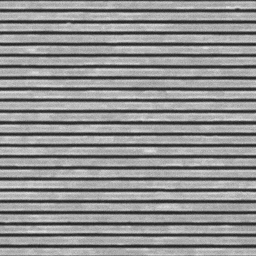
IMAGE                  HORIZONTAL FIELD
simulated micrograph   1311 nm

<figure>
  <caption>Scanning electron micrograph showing parallel lines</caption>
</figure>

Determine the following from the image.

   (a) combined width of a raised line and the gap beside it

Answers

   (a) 57.5 nanometers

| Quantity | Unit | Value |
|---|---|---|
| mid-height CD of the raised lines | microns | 0.0403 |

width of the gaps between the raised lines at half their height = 19.8 nm